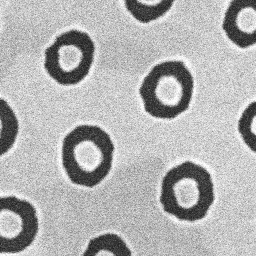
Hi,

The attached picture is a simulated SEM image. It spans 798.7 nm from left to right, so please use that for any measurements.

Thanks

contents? ring-shaped grooves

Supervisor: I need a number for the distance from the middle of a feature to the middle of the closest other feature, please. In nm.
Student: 314